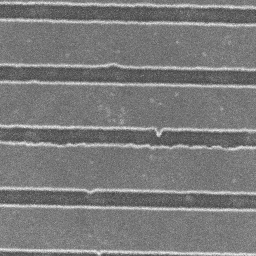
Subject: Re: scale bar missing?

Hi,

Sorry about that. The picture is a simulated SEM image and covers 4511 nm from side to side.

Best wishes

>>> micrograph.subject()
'one or a few lines or trenches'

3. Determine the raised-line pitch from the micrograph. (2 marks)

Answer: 61.8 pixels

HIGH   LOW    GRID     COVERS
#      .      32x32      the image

.............###################
................................
................................
################################
################################
################################
################################
################################
.......................#...#####
................................
############....................
################################
################################
################################
################################
################################
................................
................................
############################..##
################################
################################
################################
################################
...#############################
................................
................................
################################
################################
################################
################################
################################
............#....###############